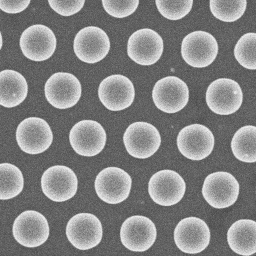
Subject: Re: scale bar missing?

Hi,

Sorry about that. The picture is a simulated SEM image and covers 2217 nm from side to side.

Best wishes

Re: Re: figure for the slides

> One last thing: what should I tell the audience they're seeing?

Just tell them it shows an array of small figures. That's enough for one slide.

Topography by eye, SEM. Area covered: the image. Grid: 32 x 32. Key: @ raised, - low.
@@@@--@@@@---@@@@---@@@@--@@@@@-
-@-----@@@---@@@@---@@@@--@@@@@-
----------------------------@@--
----@@-----@--------------------
---@@@@--@@@@---@@@@---@@@----@@
---@@@@--@@@@@--@@@@---@@@@---@@
---@@@@--@@@@@--@@@@---@@@@--@@@
----@@----@@@----@@@---@@@@---@@
-------------------------------@
@@@---@@@-----@-----------------
@@@---@@@@---@@@@---@@@---@@@@--
@@@---@@@@--@@@@@--@@@@@--@@@@--
@@@---@@@@---@@@@--@@@@---@@@@--
-------@@----@@@----@@@---@@@@--
--------------------------------
---@@@----@@----@@@-------------
--@@@@---@@@@---@@@@---@@@----@@
--@@@@---@@@@--@@@@@--@@@@@--@@@
---@@@---@@@@---@@@@--@@@@@--@@@
-----------@-----@@----@@@---@@@
@-------------------------------
@@@---@@@----@@@----@@-----@----
@@@--@@@@@--@@@@---@@@@---@@@---
@@@--@@@@@--@@@@---@@@@--@@@@@--
@@----@@@---@@@@---@@@@--@@@@@--
--------------------@@----@@@---
---@@---------------------------
--@@@@---@@@----@@@----@@-----@-
--@@@@--@@@@@--@@@@---@@@@---@@@
--@@@@--@@@@@--@@@@@--@@@@--@@@@
---@@----@@@---@@@@---@@@@---@@@
-----------------------@@----@@@